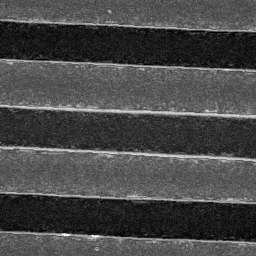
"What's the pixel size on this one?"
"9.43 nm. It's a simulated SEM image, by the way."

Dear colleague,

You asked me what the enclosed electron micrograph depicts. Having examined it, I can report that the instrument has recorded lines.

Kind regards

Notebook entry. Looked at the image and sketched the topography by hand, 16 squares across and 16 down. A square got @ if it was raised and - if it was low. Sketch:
@@@@@@@@@@@@@@@@
-----@@@@@@@@@@@
----------------
----------------
@@@@@@@@@@@@@@@@
@@@@@@@@@@@@@@@@
@@@@@@@@@@@@@@@@
----------------
----------------
@@@@@-----------
@@@@@@@@@@@@@@@@
@@@@@@@@@@@@@@@@
------------@@@@
----------------
----------------
@@@@@@@@@@@@@@@@